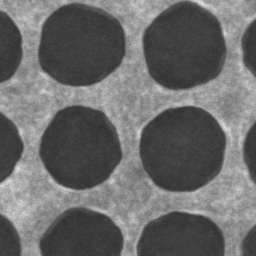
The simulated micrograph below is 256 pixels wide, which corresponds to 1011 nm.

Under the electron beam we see holes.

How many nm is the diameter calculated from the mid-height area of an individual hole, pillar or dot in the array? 340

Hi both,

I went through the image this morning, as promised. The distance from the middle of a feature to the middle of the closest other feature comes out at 404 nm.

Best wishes